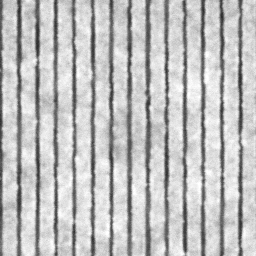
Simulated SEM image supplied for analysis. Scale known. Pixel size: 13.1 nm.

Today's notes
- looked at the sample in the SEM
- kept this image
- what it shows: parallel lines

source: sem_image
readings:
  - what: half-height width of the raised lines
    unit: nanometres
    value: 188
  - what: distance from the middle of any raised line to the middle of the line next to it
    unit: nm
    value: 242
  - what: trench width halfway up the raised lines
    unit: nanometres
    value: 58.9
